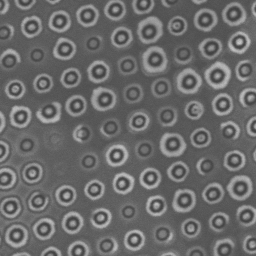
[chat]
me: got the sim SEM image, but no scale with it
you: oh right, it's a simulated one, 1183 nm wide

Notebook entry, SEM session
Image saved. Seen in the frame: a regular array of ring-shaped grooves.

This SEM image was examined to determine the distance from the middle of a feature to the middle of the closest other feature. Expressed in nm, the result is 131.